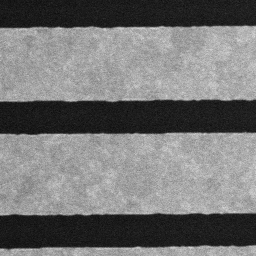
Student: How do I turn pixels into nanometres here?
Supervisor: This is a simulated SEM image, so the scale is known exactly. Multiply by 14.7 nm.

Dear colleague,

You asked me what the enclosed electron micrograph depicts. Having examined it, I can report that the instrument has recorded lines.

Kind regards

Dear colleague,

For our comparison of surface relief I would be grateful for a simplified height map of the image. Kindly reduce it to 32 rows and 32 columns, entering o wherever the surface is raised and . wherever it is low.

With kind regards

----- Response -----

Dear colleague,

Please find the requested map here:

................................
................................
................................
....oooo.oooo.oooooooooooooooooo
oooooooooooooooooooooooooooooooo
oooooooooooooooooooooooooooooooo
oooooooooooooooooooooooooooooooo
oooooooooooooooooooooooooooooooo
oooooooooooooooooooooooooooooooo
oooooooooooooooooooooooooooooooo
oooooooooooooooooooooooooooooooo
oooooooooooooooooooooooooooooooo
oooo....oo...oo.................
................................
................................
................................
................................
oooooooooooooooooooooooooooooooo
oooooooooooooooooooooooooooooooo
oooooooooooooooooooooooooooooooo
oooooooooooooooooooooooooooooooo
oooooooooooooooooooooooooooooooo
oooooooooooooooooooooooooooooooo
oooooooooooooooooooooooooooooooo
oooooooooooooooooooooooooooooooo
oooooooooooooooooooooooooooooooo
oooooooooooooooooooooooooooooooo
................................
................................
................................
................................
oooooooooooooooooooooooooooooooo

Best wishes